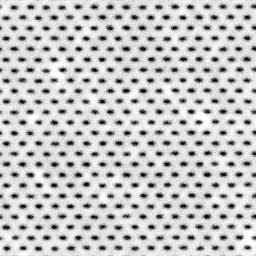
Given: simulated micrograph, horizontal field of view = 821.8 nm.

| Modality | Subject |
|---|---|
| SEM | a regular array of holes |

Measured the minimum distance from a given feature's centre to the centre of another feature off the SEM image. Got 40.8 nm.